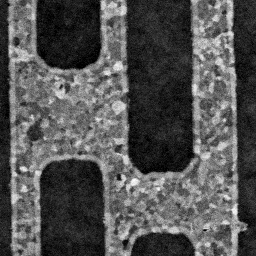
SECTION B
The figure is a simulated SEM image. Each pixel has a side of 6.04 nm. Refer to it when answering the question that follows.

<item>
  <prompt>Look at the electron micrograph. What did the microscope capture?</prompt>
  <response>one or a few lines or trenches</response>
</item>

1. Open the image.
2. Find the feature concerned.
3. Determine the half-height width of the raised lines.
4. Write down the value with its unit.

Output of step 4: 167 nm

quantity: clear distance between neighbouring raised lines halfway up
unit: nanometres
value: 426